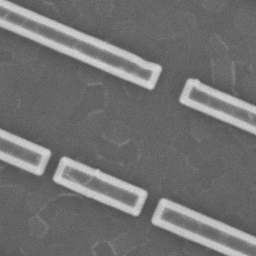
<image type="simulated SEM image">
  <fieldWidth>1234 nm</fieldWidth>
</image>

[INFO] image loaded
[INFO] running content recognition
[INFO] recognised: one or a few lines or trenches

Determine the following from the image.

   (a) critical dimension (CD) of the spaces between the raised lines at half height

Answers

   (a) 0.493 microns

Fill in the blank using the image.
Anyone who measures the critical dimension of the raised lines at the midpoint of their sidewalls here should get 92.7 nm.